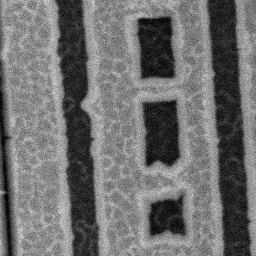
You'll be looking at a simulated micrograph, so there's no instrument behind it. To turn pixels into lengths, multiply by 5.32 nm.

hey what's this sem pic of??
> one or a few lines or trenches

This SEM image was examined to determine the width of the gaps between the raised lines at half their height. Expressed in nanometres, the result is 184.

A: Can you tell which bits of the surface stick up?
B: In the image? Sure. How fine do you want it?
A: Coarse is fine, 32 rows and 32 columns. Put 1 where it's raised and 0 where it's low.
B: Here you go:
11111100000111111111111110000011
11111110000111111111111111000011
11111110000111111000001111000011
11111110000111111000001111000011
11111110000111111000001111000011
11111110000111111000001111000011
11111110000111111000001111000011
11111110000011111000001111000011
11111110000011111000001111000011
01111110000011111000001111000011
01111110000011111111111111000011
01111110000111111111111111000001
01111110000111111100001111000001
01111110000111111000000111000001
01111110000011111000000111000001
01111111000011111100000111100001
01111111000011111100000111100001
01111111000011111100000111100001
01111111000011111100000111100001
01111111000011111100000111100001
01111111000011111100001111100001
01111111000011111111111111100001
01111111000011111111111111100001
00111111000011111111111111100001
00111111000011111111000111100000
00111111000011111100000111100000
00111111000001111100000111100000
00111111000001111100000111100000
00111111000001111100000011100000
00111111100001111100000011100000
00111111100001111111111111110000
10111111100001111111111111100000